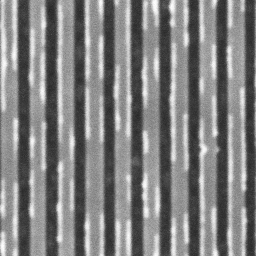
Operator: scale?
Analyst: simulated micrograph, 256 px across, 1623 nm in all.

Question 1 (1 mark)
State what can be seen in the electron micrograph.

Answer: parallel lines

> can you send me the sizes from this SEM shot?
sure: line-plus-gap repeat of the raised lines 28.4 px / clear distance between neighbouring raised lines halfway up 75.3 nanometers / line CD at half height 104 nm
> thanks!